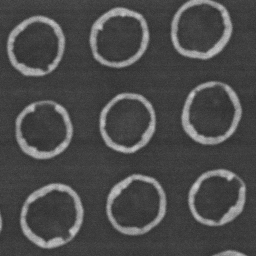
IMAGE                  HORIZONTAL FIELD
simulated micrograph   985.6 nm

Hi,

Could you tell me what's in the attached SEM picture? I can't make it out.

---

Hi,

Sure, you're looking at a regular array of raised bodies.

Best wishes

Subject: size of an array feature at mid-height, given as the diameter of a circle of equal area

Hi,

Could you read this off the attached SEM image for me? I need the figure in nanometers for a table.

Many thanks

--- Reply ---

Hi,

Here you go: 224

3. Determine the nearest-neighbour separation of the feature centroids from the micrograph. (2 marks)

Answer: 322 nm